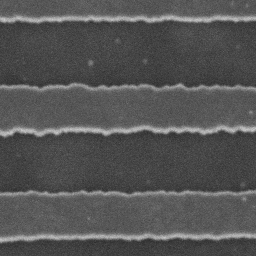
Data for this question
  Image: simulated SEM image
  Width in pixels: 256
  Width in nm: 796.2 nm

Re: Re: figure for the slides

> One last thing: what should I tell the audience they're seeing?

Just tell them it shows lines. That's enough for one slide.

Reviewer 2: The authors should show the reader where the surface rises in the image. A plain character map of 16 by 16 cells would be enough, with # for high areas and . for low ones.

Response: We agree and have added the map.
################
................
................
................
................
################
################
################
................
................
................
................
################
################
################
................